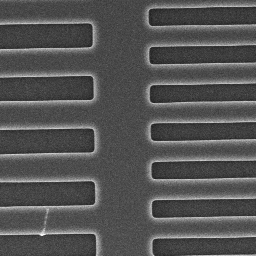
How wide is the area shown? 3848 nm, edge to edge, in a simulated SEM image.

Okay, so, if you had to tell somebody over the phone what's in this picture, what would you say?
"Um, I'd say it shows groups of lines, slits or small figures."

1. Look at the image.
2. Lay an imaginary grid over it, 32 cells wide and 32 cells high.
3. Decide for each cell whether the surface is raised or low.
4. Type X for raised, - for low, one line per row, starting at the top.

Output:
XXXXXXXXXXXXXXXXXXXXXXXXXXXXXXXX
XXXXXXXXXXXXXXXXXXX-------------
XXXXXXXXXXXXXXXXXXX-------------
------------XXXXXXXXXXXXXXXXXXXX
------------XXXXXXXXXXXXXXXXXXXX
------------XXXXXXXXXXXXXXXXXXXX
XXXXXXXXXXXXXXXXXXX-------------
XXXXXXXXXXXXXXXXXXX-------------
XXXXXXXXXXXXXXXXXXXXXXXXXXXXXXXX
XXX--------XXXXXXXXXXXXXXXXXXXXX
------------XXXXXXXXXX----------
------------XXXXXXX-------------
-----------XXXXXXXX-------------
XXXXXXXXXXXXXXXXXXXXXXXXXXXXXXXX
XXXXXXXXXXXXXXXXXXXXXXXXXXXXXXXX
XXXXXXXXXXXXXXXXXXX-------------
------------XXXXXXX-------------
------------XXXXXXX-----------XX
------------XXXXXXXXXXXXXXXXXXXX
XXXXXXXXXXXXXXXXXXXXXXXXXXXXXXXX
XXXXXXXXXXXXXXXXXXX-------------
XXXXXXXXXXXXXXXXXXX-------------
XXXXXXXXXXXXXXXXXXXXXXXXXXXXXXXX
------------XXXXXXXXXXXXXXXXXXXX
------------XXXXXXXXXXXXXXXXXXXX
------------XXXXXXX-------------
XXXXXXXXXXXXXXXXXXX-------------
XXXXXXXXXXXXXXXXXXXXXXXXXXXXXXXX
XXXXXXXXXXXXXXXXXXXXXXXXXXXXXXXX
------------XXXXXXXXXXXXXXXXXXXX
------------XXXXXXX-------------
------------XXXXXXX-------------